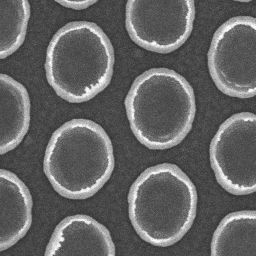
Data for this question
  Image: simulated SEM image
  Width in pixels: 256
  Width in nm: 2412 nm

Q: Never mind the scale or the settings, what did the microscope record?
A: raised bodies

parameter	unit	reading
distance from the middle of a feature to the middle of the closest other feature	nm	890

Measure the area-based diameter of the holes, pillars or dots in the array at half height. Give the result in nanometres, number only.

654